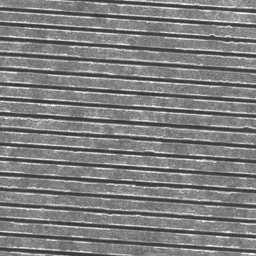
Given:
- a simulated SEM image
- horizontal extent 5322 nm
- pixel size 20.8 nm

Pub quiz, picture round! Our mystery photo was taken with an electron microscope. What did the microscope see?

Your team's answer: parallel lines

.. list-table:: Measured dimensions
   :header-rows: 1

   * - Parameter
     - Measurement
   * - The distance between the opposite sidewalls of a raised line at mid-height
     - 236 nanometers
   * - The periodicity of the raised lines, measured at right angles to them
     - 15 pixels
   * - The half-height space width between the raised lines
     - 3.49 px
